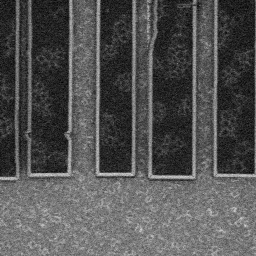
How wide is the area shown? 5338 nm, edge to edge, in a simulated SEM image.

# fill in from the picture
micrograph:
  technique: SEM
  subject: one or a few lines or trenches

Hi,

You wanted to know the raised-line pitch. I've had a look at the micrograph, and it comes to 1280 nanometers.